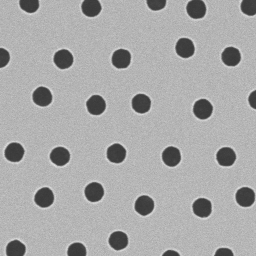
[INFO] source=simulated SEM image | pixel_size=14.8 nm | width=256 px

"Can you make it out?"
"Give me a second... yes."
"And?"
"a regular array of holes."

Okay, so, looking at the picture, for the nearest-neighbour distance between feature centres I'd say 656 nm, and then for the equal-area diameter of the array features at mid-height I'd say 297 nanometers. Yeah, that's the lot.